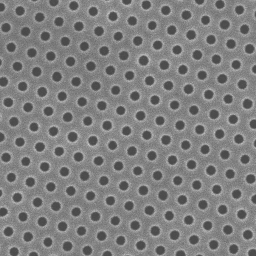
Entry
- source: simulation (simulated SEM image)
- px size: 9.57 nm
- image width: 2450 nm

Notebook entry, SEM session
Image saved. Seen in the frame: a regular array of holes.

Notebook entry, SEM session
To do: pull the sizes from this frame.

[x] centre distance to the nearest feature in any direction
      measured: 191 nm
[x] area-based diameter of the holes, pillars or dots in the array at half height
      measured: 94.2 nanometres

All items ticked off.